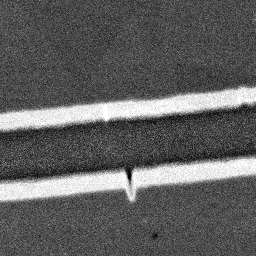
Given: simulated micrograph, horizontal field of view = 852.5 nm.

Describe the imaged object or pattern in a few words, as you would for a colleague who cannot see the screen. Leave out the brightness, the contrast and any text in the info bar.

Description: one or a few lines or trenches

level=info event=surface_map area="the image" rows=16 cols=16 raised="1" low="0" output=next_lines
1111111111111111
1111111111111111
1111111111111111
1111111111111111
1111111111111111
1111111111111111
1111111111100000
1000000000000000
0000000000000000
0000000000000000
0000000000000001
0000011111111111
1111111111111111
1111111111111111
1111111111111111
1111111111111111